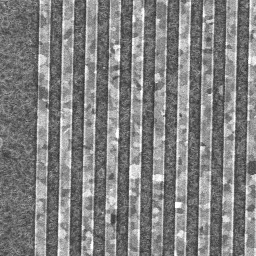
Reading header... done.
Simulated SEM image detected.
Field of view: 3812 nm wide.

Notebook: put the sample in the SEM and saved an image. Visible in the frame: parallel lines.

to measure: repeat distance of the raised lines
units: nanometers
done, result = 347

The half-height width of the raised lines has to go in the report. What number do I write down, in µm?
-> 0.147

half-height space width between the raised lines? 0.192 micrometres